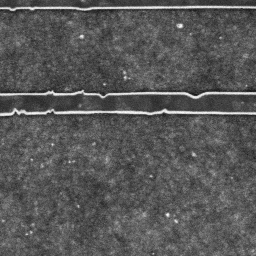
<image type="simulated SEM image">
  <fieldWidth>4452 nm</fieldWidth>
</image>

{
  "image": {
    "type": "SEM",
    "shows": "one or a few lines or trenches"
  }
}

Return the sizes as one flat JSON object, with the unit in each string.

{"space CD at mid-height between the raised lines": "1490 nm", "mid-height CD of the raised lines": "326 nm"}